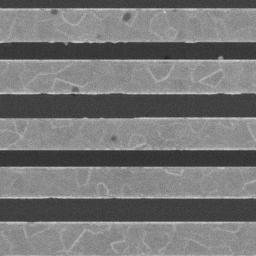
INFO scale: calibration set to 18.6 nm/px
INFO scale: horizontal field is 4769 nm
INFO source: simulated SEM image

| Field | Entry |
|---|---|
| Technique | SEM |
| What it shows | lines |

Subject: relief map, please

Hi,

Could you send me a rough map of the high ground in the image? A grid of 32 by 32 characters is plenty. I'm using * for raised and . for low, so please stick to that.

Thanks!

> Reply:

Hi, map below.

................................
********************************
********************************
********************************
********************************
................................
................................
................................
********************************
********************************
********************************
********************************
................................
................................
................................
********************************
********************************
********************************
********************************
................................
................................
********************************
********************************
********************************
********************************
................................
................................
................................
********************************
********************************
********************************
********************************